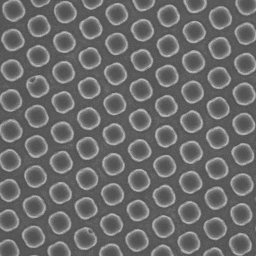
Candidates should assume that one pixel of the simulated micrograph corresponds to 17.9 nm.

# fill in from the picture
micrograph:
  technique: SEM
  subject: a regular array of raised bodies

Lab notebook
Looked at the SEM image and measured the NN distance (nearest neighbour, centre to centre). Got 0.53 µm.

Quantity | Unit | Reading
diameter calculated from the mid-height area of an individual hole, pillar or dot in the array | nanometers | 377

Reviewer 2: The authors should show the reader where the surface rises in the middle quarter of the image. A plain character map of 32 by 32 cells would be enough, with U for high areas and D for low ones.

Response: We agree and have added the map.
UUDDDUUUDDDUUUDDDDUUUUDDDUUDDDUU
UUDDDDDDDDUUUUUDDDDUDDDUUUUUDDDU
UUDDDDDDDDUUUUUDDDDDDDDUUUUUDDDD
UUDDDDDDDDDUUUUDDDDDDDDUUUUUDDDD
UDDDUUUUDDDUUUDDDDUUUDDDUUUUDDDD
DDDDUUUUUDDDDDDDDUUUUUDDDDDDDDUU
DDDDUUUUUDDDDDDDDUUUUUDDDDDDDDUU
UDDDUUUUDDDDUDDDDUUUUUDDDDDDDDUU
UUDDDDUDDDDUUUUDDDUUUDDDUUUDDDUU
UUDDDDDDDDUUUUUDDDDDDDDUUUUUDDDU
UUDDDDDDDDUUUUUDDDDDDDDUUUUUDDDD
UDDDDUUDDDDUUUUDDDDUDDDUUUUUDDDD
DDDDUUUUDDDDUDDDDUUUUDDDUUUDDDUU
DDDDUUUUUDDDDDDDDUUUUUDDDDDDDUUU
DDDDUUUUUDDDDDDDDUUUUUDDDDDDDUUU
UDDDUUUUDDDUUUDDDUUUUDDDDDDDDDUU
UUDDDDDDDDUUUUUDDDUUDDDUUUUDDDDU
UUDDDDDDDDUUUUUDDDDDDDDUUUUUDDDD
UUDDDUUDDDUUUUUDDDDDDDDUUUUUDDDD
DDDDUUUUDDDUUUDDDDUUDDDDUUUUDDDU
DDDUUUUUDDDDDDDDUUUUUDDDDUDDDDUU
DDDDUUUUDDDDDDDDUUUUUUDDDDDDDUUU
UDDDUUUUDDDDUDDDDUUUUDDDDDDDDUUU
UDDDDUUDDDUUUUDDDUUUUDDDUUUDDDUU
UUDDDDDDDDUUUUUDDDDDDDDUUUUDDDDU
UUDDDDDDDDUUUUUDDDDDDDDUUUUUDDDD
UDDDDUUDDDUUUUUDDDUDDDDUUUUUDDDD
DDDUUUUUDDDUUDDDDUUUDDDDUUUDDDUU
DDDUUUUUDDDDDDDDUUUUUDDDDDDDDUUU
DDDDUUUUDDDDDDDDUUUUUDDDDDDDDUUU
UDDDUUUUDDDUUUDDDUUUUDDDDUDDDUUU
UDDDDDDDDDUUUUDDDDUDDDDUUUUDDDUU